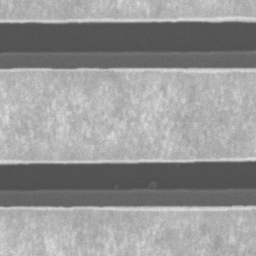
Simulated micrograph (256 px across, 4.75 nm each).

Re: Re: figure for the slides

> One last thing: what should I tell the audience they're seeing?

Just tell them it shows lines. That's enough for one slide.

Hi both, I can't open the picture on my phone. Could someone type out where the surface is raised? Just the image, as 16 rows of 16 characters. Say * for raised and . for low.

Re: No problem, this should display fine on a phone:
****************
................
................
................
****************
****************
****************
****************
****************
****************
................
................
................
****************
****************
****************